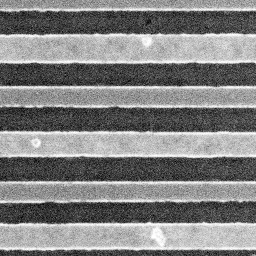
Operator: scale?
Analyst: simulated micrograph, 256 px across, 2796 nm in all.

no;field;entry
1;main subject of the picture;lines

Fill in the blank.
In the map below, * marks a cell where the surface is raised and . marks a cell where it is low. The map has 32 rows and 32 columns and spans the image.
********************************
................................
................................
................................
********************************
********************************
********************************
********************************
................................
................................
................................
********************************
********************************
................................
................................
................................
................................
********************************
********************************
.......................****.....
................................
................................
................................
********************************
********************************
................................
................................
................................
********************************
********************************
********************************
................................